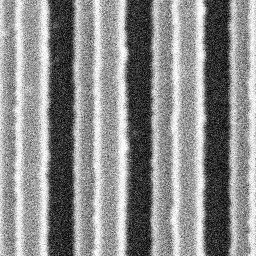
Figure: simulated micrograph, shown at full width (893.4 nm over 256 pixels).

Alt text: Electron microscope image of lines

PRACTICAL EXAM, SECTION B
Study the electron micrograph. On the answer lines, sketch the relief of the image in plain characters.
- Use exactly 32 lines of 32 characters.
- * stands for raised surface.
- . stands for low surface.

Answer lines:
******...*******...******....***
******...******....*******...***
******...******....******....***
******...******....******....***
******...******....******....***
******...******....******....***
******...*******...*******...***
******...*******...******....***
******...******....******....***
******...******....******....***
******...******....******....***
******...******....******....***
******...******....******....***
******...******....******....***
******....*****....******....***
******...******....******....***
******...******....******....***
******...*******...******....***
******...*******...******....***
******...******....******....***
******...******....******....***
******...*******...******....***
******...******....******....***
******...******....******....***
******...******....******....***
******...******....******....***
******...******....******....***
******...******....******....***
******...******....******....***
******...******....******....***
******...******....******....***
******...******....******....***